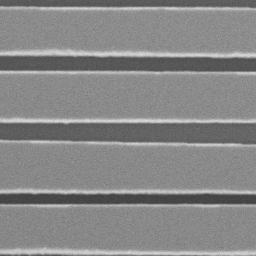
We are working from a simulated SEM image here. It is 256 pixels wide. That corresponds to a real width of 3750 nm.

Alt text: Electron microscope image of lines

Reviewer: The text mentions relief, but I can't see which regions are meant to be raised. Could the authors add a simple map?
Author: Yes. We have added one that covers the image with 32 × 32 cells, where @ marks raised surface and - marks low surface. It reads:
--------------------------------
@@@@@@@@@@@@@@@@@@@@@@@@@@@@@@@@
@@@@@@@@@@@@@@@@@@@@@@@@@@@@@@@@
@@@@@@@@@@@@@@@@@@@@@@@@@@@@@@@@
@@@@@@@@@@@@@@@@@@@@@@@@@@@@@@@@
@@@@@@@@@@@@@@@@@@@@@@@@@@@@@@@@
@@@@@@@@@@@@@@@@@@@@@@@@@@@@@@@@
--------------------------------
--------------------------------
@@@@@@@@@@@@@@@@@@@@@@@@@@@@@@@@
@@@@@@@@@@@@@@@@@@@@@@@@@@@@@@@@
@@@@@@@@@@@@@@@@@@@@@@@@@@@@@@@@
@@@@@@@@@@@@@@@@@@@@@@@@@@@@@@@@
@@@@@@@@@@@@@@@@@@@@@@@@@@@@@@@@
@@@@@@@@@@@@@@@@@@@@@@@@@@@@@@@@
--------------------------------
--------------------------------
--------------------------------
@@@@@@@@@@@@@@@@@@@@@@@@@@@@@@@@
@@@@@@@@@@@@@@@@@@@@@@@@@@@@@@@@
@@@@@@@@@@@@@@@@@@@@@@@@@@@@@@@@
@@@@@@@@@@@@@@@@@@@@@@@@@@@@@@@@
@@@@@@@@@@@@@@@@@@@@@@@@@@@@@@@@
@@@@@@@@@@@@@@@@@@@@@@@@@@@@@@@@
--------------------------------
--------------------------------
@@@@@@@@@@@@@@@@@@@@@@@@@@@@@@@@
@@@@@@@@@@@@@@@@@@@@@@@@@@@@@@@@
@@@@@@@@@@@@@@@@@@@@@@@@@@@@@@@@
@@@@@@@@@@@@@@@@@@@@@@@@@@@@@@@@
@@@@@@@@@@@@@@@@@@@@@@@@@@@@@@@@
@@@@@@@@@@@@@@@@@@@@@@@@@@@@@@@@